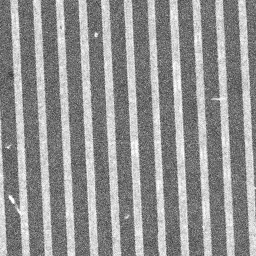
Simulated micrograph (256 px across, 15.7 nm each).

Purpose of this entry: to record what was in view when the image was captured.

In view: parallel lines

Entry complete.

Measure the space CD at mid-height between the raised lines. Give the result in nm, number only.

249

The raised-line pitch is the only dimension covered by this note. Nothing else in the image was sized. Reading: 357 nm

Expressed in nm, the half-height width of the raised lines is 110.